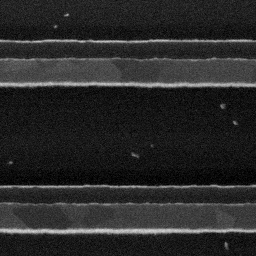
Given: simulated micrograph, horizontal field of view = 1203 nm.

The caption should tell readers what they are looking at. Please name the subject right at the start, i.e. lines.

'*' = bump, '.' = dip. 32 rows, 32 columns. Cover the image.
................................
................................
................................
................................
................................
********************************
********************************
********************************
********************************
********************************
................................
................................
................................
................................
................................
................................
................................
................................
................................
................................
................................
................................
................................
********************************
********************************
********************************
********************************
********************************
********************************
................................
................................
................................